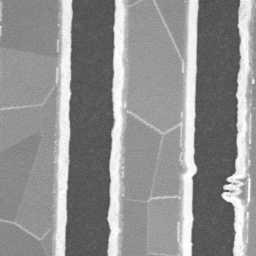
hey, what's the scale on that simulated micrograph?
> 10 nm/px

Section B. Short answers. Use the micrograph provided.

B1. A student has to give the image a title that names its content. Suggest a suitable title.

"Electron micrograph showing one or a few lines or trenches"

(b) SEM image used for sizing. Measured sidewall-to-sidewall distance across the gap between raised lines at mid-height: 0.535 microns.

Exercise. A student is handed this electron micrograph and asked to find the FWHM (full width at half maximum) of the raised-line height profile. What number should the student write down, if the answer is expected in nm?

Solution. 718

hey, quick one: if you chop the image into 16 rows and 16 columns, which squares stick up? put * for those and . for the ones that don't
****....****...*
****....****...*
****...*****...*
****...*****...*
****...*****...*
****...*****...*
****...*****...*
****...*****...*
****...*****...*
****...*****...*
****...*****...*
****...*****...*
****...*****...*
****...*****...*
****...*****...*
****...*****...*